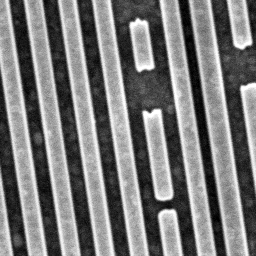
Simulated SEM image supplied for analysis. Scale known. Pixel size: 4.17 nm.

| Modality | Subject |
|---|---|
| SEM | parallel lines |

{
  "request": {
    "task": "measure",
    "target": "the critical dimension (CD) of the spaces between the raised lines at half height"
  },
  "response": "73.7 nm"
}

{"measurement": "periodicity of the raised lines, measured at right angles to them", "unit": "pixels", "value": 33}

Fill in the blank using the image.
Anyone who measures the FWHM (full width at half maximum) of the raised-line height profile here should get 66.5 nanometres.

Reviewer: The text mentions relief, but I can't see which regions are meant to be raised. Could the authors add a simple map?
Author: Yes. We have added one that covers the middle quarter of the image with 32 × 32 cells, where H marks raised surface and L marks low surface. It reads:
LHHHHLLLLLHHHHLLLLHHHHLLLLLHHHHL
LHHHHLLLLLHHHHLLLLLLLLLLLLLHHHHL
LHHHHHLLLLHHHHLLLLLLLLLLLLLHHHHL
LLHHHHLLLLHHHHLLLLLLLLLLLLLHHHHL
LLHHHHLLLLHHHHLLLLLLLLLLLLLHHHHL
LLHHHHLLLLLHHHHLLLLLLLLLLLLHHHHH
LLHHHHLLLLLHHHHLLLLLLLLLLLLLHHHH
LLHHHHLLLLLHHHHLLLLLLLLLLLLLHHHH
LLHHHHLLLLLHHHHLLLLLLLLLLLLLHHHH
LLLHHHHLLLLHHHHLLLLLLLLLLLLLHHHH
LLLHHHHLLLLHHHHLLLLLLLLLLLLLHHHH
LLLHHHHLLLLLHHHLLLLLLLLLLLLLHHHH
LLLHHHHLLLLLHHHHLLLLHLHHLLLLHHHH
LLLHHHHLLLLLHHHHLLLLHHHHLLLLLHHH
LLLHHHHLLLLLHHHHLLLLHHHHLLLLLHHH
LLLLHHHLLLLLHHHHLLLLHHHHHLLLLHHH
LLLLHHHHLLLLHHHHLLLLLHHHHLLLLHHH
LLLLHHHHLLLLHHHHLLLLLHHHHLLLLHHH
LLLLHHHHLLLLLHHHLLLLLHHHHLLLLHHH
LLLLHHHHLLLLLHHHHLLLLHHHHLLLLLHH
LLLLHHHHLLLLLHHHHLLLLHHHHLLLLLHH
LLLLLHHHLLLLLHHHHLLLLHHHHLLLLLHH
LLLLLHHHHLLLLHHHHLLLLHHHHHLLLLHH
LLLLLHHHHLLLLHHHHLLLLLHHHHLLLLHH
LLLLLHHHHLLLLHHHHLLLLLHHHHLLLLHH
LLLLLHHHHLLLLLHHHHLLLLHHHHLLLLHH
HLLLLHHHHLLLLLHHHHLLLLHHHHLLLLLH
HLLLLHHHHLLLLLHHHHLLLLHHHHLLLLLH
HLLLLLHHHLLLLLHHHHLLLLHHHHLLLLLH
HLLLLLHHHHLLLLHHHHLLLLHHHHHLLLLH
HLLLLLHHHHLLLLHHHHLLLLLHHHHLLLLH
HLLLLLHHHHLLLLLHHHLLLLLHHHHLLLLH